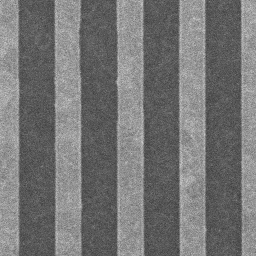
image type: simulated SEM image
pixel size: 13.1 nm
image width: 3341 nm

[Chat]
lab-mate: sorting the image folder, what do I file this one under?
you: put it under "one or a few lines or trenches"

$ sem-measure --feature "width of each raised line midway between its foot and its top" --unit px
23.8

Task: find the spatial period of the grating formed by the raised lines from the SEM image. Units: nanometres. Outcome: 810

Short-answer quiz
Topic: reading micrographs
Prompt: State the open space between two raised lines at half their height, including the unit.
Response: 496 nanometers